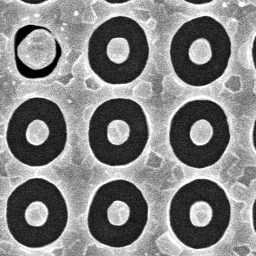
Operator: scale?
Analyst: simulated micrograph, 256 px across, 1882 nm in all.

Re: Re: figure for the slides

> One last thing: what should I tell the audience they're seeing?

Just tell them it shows a regular array of ring-shaped grooves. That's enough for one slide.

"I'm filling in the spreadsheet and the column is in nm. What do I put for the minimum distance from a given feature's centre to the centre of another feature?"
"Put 593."